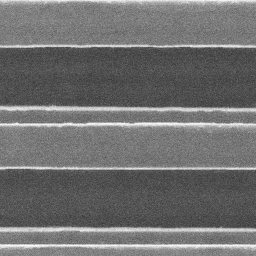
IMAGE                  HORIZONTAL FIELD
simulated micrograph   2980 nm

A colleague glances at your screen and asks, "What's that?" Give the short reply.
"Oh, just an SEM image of lines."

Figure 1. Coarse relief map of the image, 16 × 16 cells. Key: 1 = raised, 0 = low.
1111111111111111
1111111111111111
1111111111111111
0000000000000000
0000000000000000
0000000000000000
0000000000000000
1111111111111111
1111111111111111
1111111111111111
1111111111111111
0000000000000000
0000000000000000
0000000000000000
1111111111111111
1111111111111111